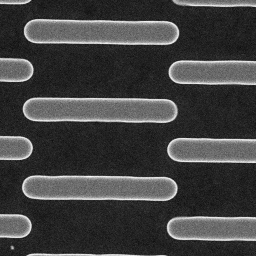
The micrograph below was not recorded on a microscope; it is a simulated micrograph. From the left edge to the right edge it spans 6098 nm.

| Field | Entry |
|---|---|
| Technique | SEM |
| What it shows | groups of lines, slits or small figures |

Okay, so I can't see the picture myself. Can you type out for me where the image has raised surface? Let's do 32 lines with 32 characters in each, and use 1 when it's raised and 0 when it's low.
00000000000000000000000111111111
00000000000000000000000000000000
00001100000000000000000000000000
00011111111111111111110000000000
00011111111111111111110000000000
00000000000000000000000000000000
00000000000000000000000000000000
11100000000000000000000000000000
11110000000000000000011111111111
11110000000000000000011111111111
00000000000000000000000000000000
00000000000000000000000000000000
00001111111111111111100000000000
00011111111111111111110000000000
00011111111111111111110000000000
00000000000000000000000000000000
00000000000000000000000000000000
11110000000000000000001111111111
11110000000000000000011111111111
11100000000000000000011111111111
00000000000000000000000000000000
00000000000000000000000000000000
00011111111111111111100000000000
00011111111111111111110000000000
00011111111111111111110000000000
00000000000000000000000000000000
00000000000000000000000000000000
11110000000000000000001111111111
11110000000000000000011111111111
11100000000000000000011111111111
00000000000000000000000000000000
00000000000000000000000000000000